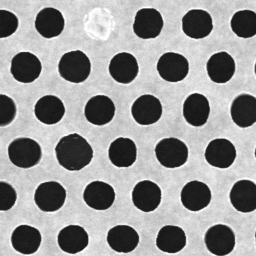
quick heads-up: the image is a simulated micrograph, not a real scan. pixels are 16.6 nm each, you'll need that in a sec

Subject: a regular array of holes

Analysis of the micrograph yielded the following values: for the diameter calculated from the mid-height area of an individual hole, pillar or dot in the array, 509 nanometers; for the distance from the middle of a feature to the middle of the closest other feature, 48.4 pixels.